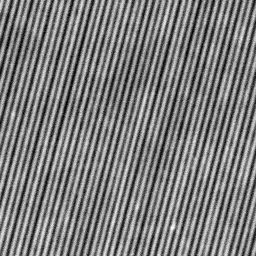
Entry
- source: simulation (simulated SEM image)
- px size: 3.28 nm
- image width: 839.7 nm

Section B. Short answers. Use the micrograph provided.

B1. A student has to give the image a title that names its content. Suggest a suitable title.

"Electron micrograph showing parallel lines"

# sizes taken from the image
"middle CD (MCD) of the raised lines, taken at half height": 3.38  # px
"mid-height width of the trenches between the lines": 11.1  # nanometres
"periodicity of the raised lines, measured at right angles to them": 21.4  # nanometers